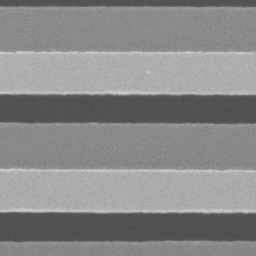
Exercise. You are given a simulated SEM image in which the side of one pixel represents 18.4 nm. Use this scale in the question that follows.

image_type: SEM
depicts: lines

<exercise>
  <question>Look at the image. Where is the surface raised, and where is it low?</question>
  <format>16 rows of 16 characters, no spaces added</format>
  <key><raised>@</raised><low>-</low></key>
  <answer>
@@@@@@@@@@@@@@@@
@@@@@@@@@@@@@@@@
@@@@@@@@@@@@@@@@
@@@@@@@@@@@@@@@@
@@@@@@@@@@@@@@@@
@@@@@@@@@@@@@@@@
----------------
----------------
@@@@@@@@@@@@@@@@
@@@@@@@@@@@@@@@@
@@@@@@@@@@@@@@@@
@@@@@@@@@@@@@@@@
@@@@@@@@@@@@@@@@
----------------
----------------
@@@@@@@@@@@@@@@@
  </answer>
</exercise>